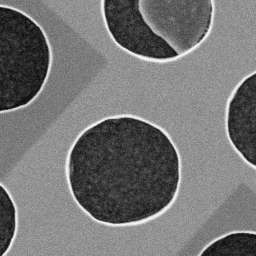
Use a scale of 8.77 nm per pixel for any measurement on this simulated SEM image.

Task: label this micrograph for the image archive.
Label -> holes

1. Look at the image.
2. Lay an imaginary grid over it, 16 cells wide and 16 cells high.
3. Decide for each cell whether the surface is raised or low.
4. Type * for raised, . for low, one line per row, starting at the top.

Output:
******.......***
..*****......***
...****......***
...******..*****
...*************
...************.
..************..
*******..*****..
*****.....****..
****.......****.
****.......*****
****.......*****
.****......*****
.*****...*******
.***************
*************...